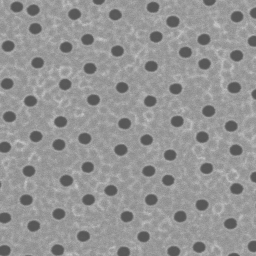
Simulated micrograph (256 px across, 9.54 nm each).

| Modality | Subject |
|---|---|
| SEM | a regular array of holes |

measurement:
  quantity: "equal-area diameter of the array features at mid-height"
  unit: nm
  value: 118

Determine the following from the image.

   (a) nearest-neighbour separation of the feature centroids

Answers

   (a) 251 nm